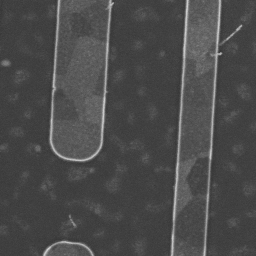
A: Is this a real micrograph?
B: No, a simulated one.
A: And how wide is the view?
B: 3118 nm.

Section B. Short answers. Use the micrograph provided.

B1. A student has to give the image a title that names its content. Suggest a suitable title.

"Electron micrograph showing one or a few lines or trenches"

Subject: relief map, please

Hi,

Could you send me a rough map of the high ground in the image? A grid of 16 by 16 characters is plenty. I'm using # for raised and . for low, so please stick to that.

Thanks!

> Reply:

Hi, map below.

....###.....##..
....###.....##..
....###.....##..
...####.....##..
...####....##...
...####....##...
...####....##...
...###.....##...
...###.....##...
....##.....##...
...........##...
...........##...
...........##...
...........##...
...........##...
...##......##...